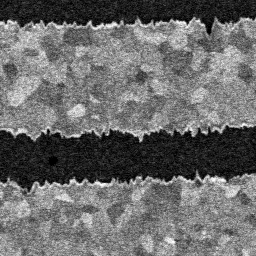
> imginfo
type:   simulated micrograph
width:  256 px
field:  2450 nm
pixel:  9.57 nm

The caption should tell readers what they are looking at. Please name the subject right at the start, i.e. one or a few lines or trenches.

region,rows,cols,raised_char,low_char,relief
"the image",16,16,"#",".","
................
#.......#.###..#
################
################
################
################
################
################
........#.......
................
................
#...############
################
################
################
################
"